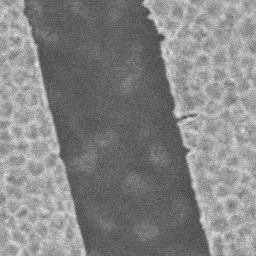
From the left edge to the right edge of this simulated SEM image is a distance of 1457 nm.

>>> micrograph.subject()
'one or a few lines or trenches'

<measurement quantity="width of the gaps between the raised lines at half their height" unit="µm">0.697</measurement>